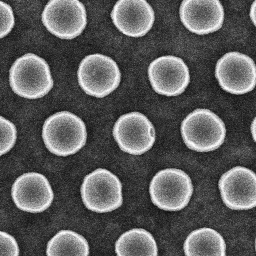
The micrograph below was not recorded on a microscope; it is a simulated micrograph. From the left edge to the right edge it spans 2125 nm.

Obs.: a regular array of raised bodies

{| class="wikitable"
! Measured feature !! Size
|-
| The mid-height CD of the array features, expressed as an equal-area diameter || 339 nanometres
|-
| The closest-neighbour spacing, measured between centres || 0.548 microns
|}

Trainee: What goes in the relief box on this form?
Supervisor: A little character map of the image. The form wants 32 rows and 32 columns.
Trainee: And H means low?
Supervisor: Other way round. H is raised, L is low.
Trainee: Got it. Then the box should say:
HLLLLLHHHHLLLLLHHHLLLLLHHHHLLLLL
HLLLLHHHHHLLLLHHHHHLLLLHHHHHLLLH
HHLLLHHHHHHLLLHHHHHLLLLHHHHHLLLL
HLLLLLHHHHLLLLLHHHHLLLLLHHHLLLLL
LLLLLLLHHLLLLLLLLLLLLLLLLLLLLLLL
LLLLLLLLLLLLLLLLLLLLLLLLLLLLLLLL
LLLLLLLLLLLLLLLLLLLLLLLLLLLLLLLL
LLHHHLLLLLHHHHLLLLLLHHHLLLLLHHHL
LLHHHHLLLLHHHHHLLLLHHHHLLLLHHHHH
LHHHHHLLLLHHHHHLLLLHHHHHLLLHHHHH
LHHHHHLLLLHHHHHLLLLHHHHLLLLLHHHH
LLHHHHLLLLLHHHLLLLLLHHLLLLLLLHHL
LLLLLLLLLLLLLLLLLLLLLLLLLLLLLLLL
LLLLLLLLLLLLLLLLLLLLLLLLLLLLLLLL
LLLLLLLHHLLLLLLLHHLLLLLLHHHLLLLL
HLLLLLHHHHLLLLLHHHHLLLLHHHHHLLLL
HHLLLHHHHHHLLLHHHHHLLLLHHHHHLLLL
HHLLLLHHHHHLLLLHHHHLLLLHHHHHLLLL
HLLLLLHHHHLLLLLHHHHLLLLLHHHLLLLL
LLLLLLLLLLLLLLLLLLLLLLLLLLLLLLLL
LLLLLLLLLLLLLLLLLLLLLLLLLLLLLLLL
LLLLLLLLLLLLHLLLLLLLHHHLLLLLLHHL
LLHHHHLLLLLHHHHLLLLHHHHHLLLLHHHH
LLHHHHLLLLHHHHHLLLLHHHHHLLLLHHHH
LLHHHHLLLLHHHHHLLLLHHHHHLLLLHHHH
LLHHHHLLLLLHHHHLLLLLHHHLLLLLHHHH
LLLLLLLLLLLLLLLLLLLLLLLLLLLLLLLL
LLLLLLLLLLLLLLLLLLLLLLLLLLLLLLLL
LLLLLLLLLLLLLLLLLLLLLLLLLLLLLLLL
HLLLLLLHHHLLLLLHHHHLLLLLHHHLLLLL
HHLLLLHHHHHLLLLHHHHLLLLHHHHHLLLL
HHLLLLHHHHHLLLLHHHHHLLLHHHHHLLLL